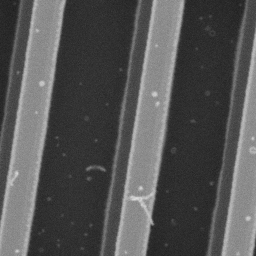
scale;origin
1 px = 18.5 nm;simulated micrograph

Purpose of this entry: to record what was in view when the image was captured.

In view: lines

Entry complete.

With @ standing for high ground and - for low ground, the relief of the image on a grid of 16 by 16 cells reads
-@@@-----@@----@
-@@@-----@@----@
-@@@----@@@----@
-@@@----@@@----@
-@@-----@@@----@
-@@-----@@@----@
@@@-----@@@---@@
@@@-----@@----@@
@@@-----@@----@@
@@@----@@@----@@
@@-----@@@----@@
@@-----@@@----@@
@@-----@@@----@@
@@-----@@@---@@@
@@-----@@----@@@
@@----@@@----@@@